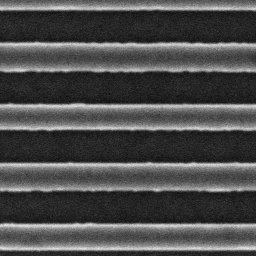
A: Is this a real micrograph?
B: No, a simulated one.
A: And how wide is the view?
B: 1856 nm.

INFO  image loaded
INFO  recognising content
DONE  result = lines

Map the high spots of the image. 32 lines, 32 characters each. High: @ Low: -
@@@@@@@@@@@@@@@@@@@@@@@@@@@@@@@@
--------------------------------
--------------------------------
--------------------------------
--------------------------------
@@@@@@@@@@@@-@@-@--@@@@@@---@@@-
@@@@@@@@@@@@@@@@@@@@@@@@@@@@@@@@
@@@@@@@@@@@@@@@@@@@@@@@@@@@@@@@@
@@@@@@@@@@@@@@@@@@@@@@@@@@@@@@@@
--------------------------------
--------------------------------
--------------------------------
--------------------------------
@@@@@@@@@@@@@@@@@@@@@@@@@@@@@@@@
@@@@@@@@@@@@@@@@@@@@@@@@@@@@@@@@
@@@@@@@@@@@@@@@@@@@@@@@@@@@@@@@@
--------------------------------
--------------------------------
--------------------------------
--------------------------------
@@@@@@@@@@@@@@@@@@@@@@@@@@@@@@@@
@@@@@@@@@@@@@@@@@@@@@@@@@@@@@@@@
@@@@@@@@@@@@@@@@@@@@@@@@@@@@@@@@
@@@@@@@@@@@@@@@@@@@@@@@@@@@@@@@@
--------------------------------
--------------------------------
--------------------------------
--------------------------------
@@@@@@@@@@@@@@@@@@@@@@@@@@@@@@@@
@@@@@@@@@@@@@@@@@@@@@@@@@@@@@@@@
@@@@@@@@@@@@@@@@@@@@@@@@@@@@@@@@
--------------------------------